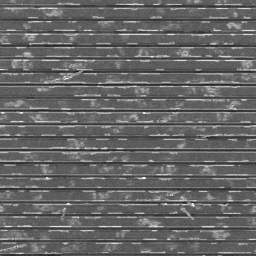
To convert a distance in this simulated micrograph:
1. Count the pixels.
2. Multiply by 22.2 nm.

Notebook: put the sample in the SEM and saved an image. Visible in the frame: parallel lines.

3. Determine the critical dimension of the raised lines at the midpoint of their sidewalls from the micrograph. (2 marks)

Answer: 234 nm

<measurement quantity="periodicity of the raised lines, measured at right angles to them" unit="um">0.29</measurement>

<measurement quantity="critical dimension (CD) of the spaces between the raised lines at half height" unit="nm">63.9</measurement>